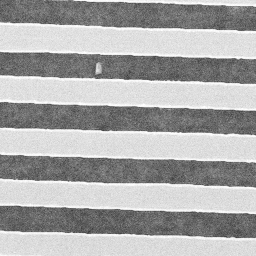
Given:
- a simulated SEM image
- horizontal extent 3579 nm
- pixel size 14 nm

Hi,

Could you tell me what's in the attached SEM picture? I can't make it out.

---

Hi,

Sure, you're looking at lines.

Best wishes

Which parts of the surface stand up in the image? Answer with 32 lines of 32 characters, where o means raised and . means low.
.........................ooooooo
................................
................................
ooooooooooooooo.................
oooooooooooooooooooooooooooooooo
oooooooooooooooooooooooooooooooo
......oooooooooooooooooooooooooo
................................
................................
................................
oooooooooooooooooooooooooooooo..
oooooooooooooooooooooooooooooooo
oooooooooooooooooooooooooooooooo
.......................ooooooooo
................................
................................
ooooooooooooooooooo.............
oooooooooooooooooooooooooooooooo
oooooooooooooooooooooooooooooooo
......oooooooooooooooooooooooooo
................................
................................
oo..............................
ooooooooooooooooooooooooooooooo.
oooooooooooooooooooooooooooooooo
oooooooooooooooooooooooooooooooo
...........................ooooo
................................
................................
oooooooooooooooooo..............
oooooooooooooooooooooooooooooooo
oooooooooooooooooooooooooooooooo